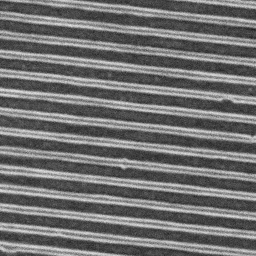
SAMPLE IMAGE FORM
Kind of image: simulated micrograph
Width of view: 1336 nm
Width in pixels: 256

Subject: parallel lines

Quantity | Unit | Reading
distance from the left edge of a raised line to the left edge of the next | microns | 0.0997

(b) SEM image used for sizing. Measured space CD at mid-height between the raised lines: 0.0695 microns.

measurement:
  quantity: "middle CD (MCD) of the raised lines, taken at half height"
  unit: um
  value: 0.0279